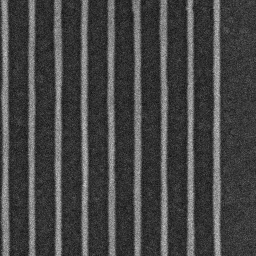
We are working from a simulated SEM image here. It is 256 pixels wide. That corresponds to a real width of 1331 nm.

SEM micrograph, parallel lines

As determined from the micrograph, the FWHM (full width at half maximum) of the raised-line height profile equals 26.6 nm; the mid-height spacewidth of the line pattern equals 111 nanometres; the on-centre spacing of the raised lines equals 0.137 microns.